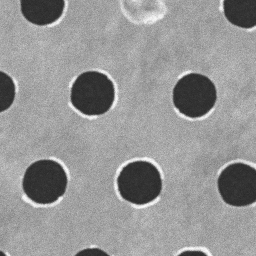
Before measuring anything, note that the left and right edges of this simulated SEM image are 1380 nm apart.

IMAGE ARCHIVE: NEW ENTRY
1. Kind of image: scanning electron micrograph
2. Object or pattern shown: holes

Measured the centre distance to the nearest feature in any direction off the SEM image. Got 0.526 µm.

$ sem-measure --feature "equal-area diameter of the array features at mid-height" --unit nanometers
238